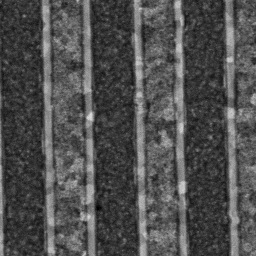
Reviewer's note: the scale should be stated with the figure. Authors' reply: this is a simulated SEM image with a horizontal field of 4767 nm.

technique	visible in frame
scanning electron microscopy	one or a few lines or trenches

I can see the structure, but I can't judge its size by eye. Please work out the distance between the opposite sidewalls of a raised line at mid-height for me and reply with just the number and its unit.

759 nm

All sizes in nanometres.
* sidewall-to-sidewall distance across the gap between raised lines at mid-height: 945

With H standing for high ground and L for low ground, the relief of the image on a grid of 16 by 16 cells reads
LLLHHLLLLHHLLLHH
LLLHHLLLLHHLLLHH
LLLHHLLLLHHLLLHH
LLLHHLLLLHHLLLHH
LLLHHLLLLHHLLLHH
LLLHHHLLLHHLLLHH
LLLHHHLLLHHLLLHH
LLLHHHLLLHHLLLHH
LLLHHHLLLHHLLLHH
LLLHHHLLLHHLLLLH
LLLHHHLLLHHLLLLH
LLLHHHLLLHHLLLLH
LLLHHHLLLHHLLLLH
LLLHHHLLLHHLLLLH
LLLHHHLLLHHLLLLH
LLLHHHLLLHHLLLLH